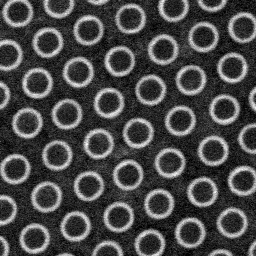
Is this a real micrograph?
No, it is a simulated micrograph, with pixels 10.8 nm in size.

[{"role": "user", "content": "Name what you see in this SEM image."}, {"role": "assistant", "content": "a regular array of raised bodies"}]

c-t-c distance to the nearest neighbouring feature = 42.1 pixels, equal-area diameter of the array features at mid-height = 300 nm